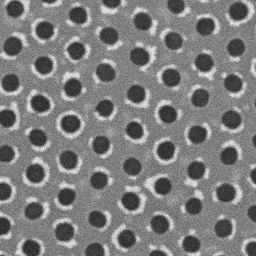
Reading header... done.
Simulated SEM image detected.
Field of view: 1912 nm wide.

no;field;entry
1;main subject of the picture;a regular array of holes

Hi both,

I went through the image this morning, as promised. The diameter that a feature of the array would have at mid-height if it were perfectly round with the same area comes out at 140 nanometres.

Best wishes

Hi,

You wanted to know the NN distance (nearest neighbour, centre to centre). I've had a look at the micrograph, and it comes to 264 nm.